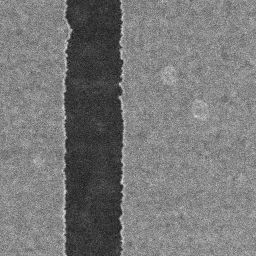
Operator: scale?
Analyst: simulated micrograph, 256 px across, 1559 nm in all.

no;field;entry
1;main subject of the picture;one or a few lines or trenches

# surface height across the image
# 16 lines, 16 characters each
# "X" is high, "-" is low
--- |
XXXX----XXXXXXXX
XXXX----XXXXXXXX
XXXX----XXXXXXXX
XXXX----XXXXXXXX
XXXX----XXXXXXXX
XXXX----XXXXXXXX
XXXX----XXXXXXXX
XXXX----XXXXXXXX
XXXX----XXXXXXXX
XXXX----XXXXXXXX
XXXX----XXXXXXXX
XXXX----XXXXXXXX
XXXX----XXXXXXXX
XXXX----XXXXXXXX
XXXX----XXXXXXXX
XXXX----XXXXXXXX